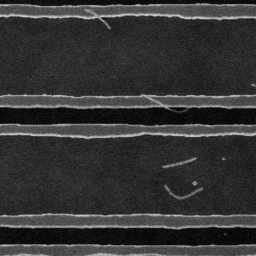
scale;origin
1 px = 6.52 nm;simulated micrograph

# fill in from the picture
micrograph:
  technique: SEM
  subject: lines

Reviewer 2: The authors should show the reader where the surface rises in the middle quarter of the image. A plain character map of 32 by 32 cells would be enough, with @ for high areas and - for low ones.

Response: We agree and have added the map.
--------------------------------
--------------------------------
--------------------------------
--------------------------------
--------------------------------
--------------------------------
--------------------------------
--------------------------------
@@@@@@@@@@@@@@@@@@@@@@@@@@@@@@@@
@@@@@@@@@@@@@@@@@@@@@@@@@@@@@@@@
@@@@@@@@@@@@@@@@@@@@@@@@@@@@@@@@
--------------------------------
--------------------------------
--------------------------------
--------------------------------
@@@@@@@@@@@@@@@@@@@@--@@@@@@@@@@
@@@@@@@@@@@@@@@@@@@@@@@@@@@@@@@@
@@@@@@@@@@@@@@@@@@@@--@@@@@@@@@@
-----@@-------------------------
--------------------------------
--------------------------------
--------------------------------
--------------------------------
--------------------------------
--------------------------------
--------------------------------
--------------------------------
--------------------------------
--------------------------------
--------------------------------
--------------------------------
--------------------------------